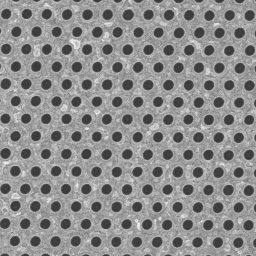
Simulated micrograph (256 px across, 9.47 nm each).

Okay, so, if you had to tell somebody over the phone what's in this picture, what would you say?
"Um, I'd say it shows a regular array of holes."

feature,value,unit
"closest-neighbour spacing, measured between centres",0.188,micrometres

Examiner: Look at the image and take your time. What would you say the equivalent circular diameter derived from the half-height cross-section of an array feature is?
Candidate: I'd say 93.1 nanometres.